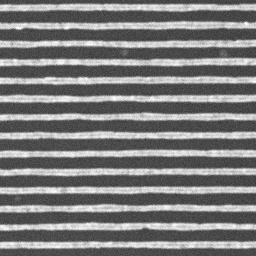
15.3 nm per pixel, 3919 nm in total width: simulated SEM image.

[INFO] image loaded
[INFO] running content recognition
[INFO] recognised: parallel lines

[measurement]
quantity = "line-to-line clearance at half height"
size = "14.5 pixels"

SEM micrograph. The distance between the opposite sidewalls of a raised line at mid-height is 0.0651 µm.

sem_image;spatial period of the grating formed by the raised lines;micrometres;0.28